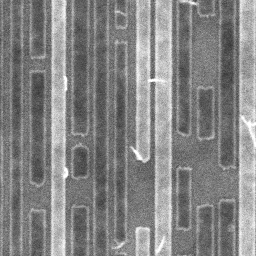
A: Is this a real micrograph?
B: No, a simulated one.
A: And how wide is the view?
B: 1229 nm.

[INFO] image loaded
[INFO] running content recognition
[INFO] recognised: parallel lines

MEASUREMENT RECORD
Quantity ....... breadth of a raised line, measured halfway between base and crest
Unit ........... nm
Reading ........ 70.8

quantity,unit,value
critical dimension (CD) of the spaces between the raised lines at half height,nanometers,28.8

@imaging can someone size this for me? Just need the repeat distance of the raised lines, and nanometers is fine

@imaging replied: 101